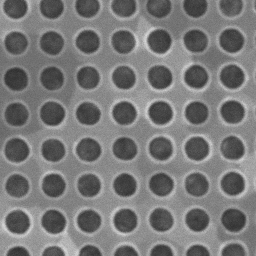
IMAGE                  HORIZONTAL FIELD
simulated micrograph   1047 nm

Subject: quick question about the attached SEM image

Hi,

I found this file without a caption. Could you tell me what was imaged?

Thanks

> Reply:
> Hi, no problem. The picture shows a regular array of holes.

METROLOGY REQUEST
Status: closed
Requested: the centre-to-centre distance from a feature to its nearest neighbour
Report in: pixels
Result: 35.6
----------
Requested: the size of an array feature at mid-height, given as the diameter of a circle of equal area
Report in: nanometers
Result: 105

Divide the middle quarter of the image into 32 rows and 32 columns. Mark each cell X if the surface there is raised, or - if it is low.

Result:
XXXXX--XXXXXX---XXXXXX---XXXXXX-
XXX-----XXXX-----XXXX-----XXXX--
XXX------XXX------XXX------XXX--
XXX------XXX------XXX------XXX--
XXX------XXX------XXX------XXX--
XXXX----XXXXX-----XXXX----XXXXX-
XXXXX--XXXXXXX--XXXXXXXX-XXXXXXX
XXXXXXXXXXXXXXXXXXXXXXXXXXXXXXXX
XXXXXXXXXXXXXXXXXXXXXXXXXXXXXXXX
XXXXX--XXXXXXX---XXXXX----XXXXXX
XXX------XXX------XXX------XXX--
XXX------XXX------XXX------XXX--
XXX------XXX------XXX------XXX--
XXX------XXX------XXX------XXX--
XXXX-----XXXX-----XXXX----XXXXX-
XXXXX--XXXXXXXX-XXXXXXXXXXXXXXXX
XXXXXXXXXXXXXXXXXXXXXXXXXXXXXXXX
XXXXXXXXXXXXXXXXXXXXXXXXXXXXXXXX
XXXXX--XXXXXX----XXXXX----XXXXXX
XXXX-----XXX------XXX------XXXX-
XXX------XXX-------XX------XXX--
-XX-------XX-------XX-------XX--
-XX------XXX------XXX------XXX--
XXXX-----XXXX-----XXXX-----XXXX-
XXXXX--XXXXXXXXXXXXXXXXXXXXXXXXX
XXXXXXXXXXXXXXXXXXXXXXXXXXXXXXXX
XXXXXXXXXXXXXXXXXXXXXXXXXXXXXXXX
XXXXX---XXXXXX---XXXXX----XXXXX-
XXX------XXXX-----XXX------XXX--
XXX------XXX------XXX-------XX--
-XX-------XX-------XX-------XX--
XXX------XXX------XXX------XXX--